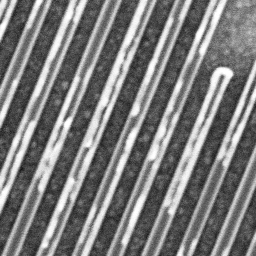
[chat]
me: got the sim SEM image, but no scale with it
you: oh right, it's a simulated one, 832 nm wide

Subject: parallel lines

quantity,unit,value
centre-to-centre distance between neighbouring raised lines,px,32.3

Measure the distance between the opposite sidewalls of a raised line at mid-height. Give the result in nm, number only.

44.8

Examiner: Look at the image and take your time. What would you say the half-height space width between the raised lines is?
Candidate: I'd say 60.2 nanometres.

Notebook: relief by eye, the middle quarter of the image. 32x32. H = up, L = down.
LLLLHHHLLLLLLHHHLLLLLHHHHLLLLLHH
LLLLHHHLLLLLHHHHLLLLLHHHHLLLLLHH
LLLHHHHLLLLLHHHLLLLLLHHHLLLLLHHH
LLLHHHLLLLLHHHHLLLLLHHHHLLLLLHHH
LLHHHHLLLLLHHHLLLLLLHHHLLLLLHHHH
LLHHHLLLLLLHHHLLLLLHHHHLLLLLHHHH
LHHHHLLLLLHHHHLLLLLHHHHLLLLLHHHL
LHHHHLLLLLHHHLLLLLLHHHLLLLLHHHHL
LHHHLLLLLHHHHLLLLLHHHHLLLLLHHHLL
HHHHLLLLLHHHLLLLLLHHHLLLLLHHHHLL
HHHLLLLLLHHHLLLLLHHHHLLLLLHHHLLL
HHHLLLLLHHHHLLLLLHHHHLLLLLHHHLLL
HHLLLLLLHHHLLLLLHHHHLLLLLHHHHLLL
HHLLLLLHHHHLLLLLHHHHLLLLLHHHLLLL
HHLLLLLHHHLLLLLLHHHLLLLLHHHHLLLL
HLLLLLLHHHLLLLLHHHHLLLLLHHHLLLLL
HLLLLLHHHHLLLLLHHHHLLLLLHHHLLLLL
LLLLLLHHHLLLLLHHHHLLLLLHHHHLLLLL
LLLLLHHHHLLLLLHHHHLLLLLHHHLLLLLL
LLLLLHHHLLLLLLHHHLLLLLHHHHLLLLLH
LLLLLHHHLLLLLHHHHLLLLLHHHHLLLLLH
LLLLHHHHLLLLLHHHLLLLLLHHHLLLLLHH
LLLLHHHLLLLLHHHHLLLLLHHHHLLLLLHH
LLLHHHHLLLLLHHHHLLLLLHHHLLLLLHHH
LLLHHHLLLLLLHHHLLLLLHHHHLLLLLHHH
LLHHHHLLLLLHHHHLLLLLHHHHLLLLLHHH
LLHHHHLLLLLHHHLLLLLLHHHLLLLLHHHH
LLHHHLLLLLHHHHLLLLLHHHHLLLLLHHHL
LHHHHLLLLLHHHHLLLLLHHHLLLLLHHHHL
LHHHLLLLLLHHHLLLLLHHHHLLLLLHHHLL
HHHHLLLLLHHHHLLLLLHHHHLLLLLHHHLL
HHHLLLLLLHHHLLLLLLHHHLLLLLHHHHLL